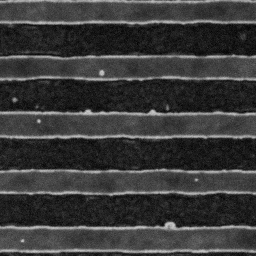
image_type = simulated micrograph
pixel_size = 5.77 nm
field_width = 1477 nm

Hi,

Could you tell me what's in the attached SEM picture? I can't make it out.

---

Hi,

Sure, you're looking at lines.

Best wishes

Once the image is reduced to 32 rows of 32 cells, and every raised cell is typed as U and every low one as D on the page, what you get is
UUUUUUUUUUUUUUUUUUUUUUUUUUUUUUUU
UUUUUUUUUUUUUUUUUUUUUUUUUUUUUUUU
UUUUUUUUUUUUUUUUUUUUUUUUUUUUUUUU
DDDDDDDDDDDDDDDDDDDDDDDDDDDDDDDD
DDDDDDDDDDDDDDDDDDDDDDDDDDDDDDDD
DDDDDDDDDDDDDDDDDDDDDDDDDDDDDDDD
DDDDDDDDDDDDDDDDDDDDDDDDDDDDDDDD
UUUUUUUUUUUUUUUUUUUUUUUUUUUUUUUU
UUUUUUUUUUUUUUUUUUUUUUUUUUUUUUUU
UUUUUUUUUUUUUUUUUUUUUUUUUUUUUUUU
DDDDDDDDDDDDDDDDDDDDDDDDDDDDDDDD
DDDDDDDDDDDDDDDDDDDDDDDDDDDDDDDD
DDDDDDDDDDDDDDDDDDDDDDDDDDDDDDDD
DDDDDDDDDDDDDDDDDDDDDDDDDDDDDDDD
UUUUUUUUUUUUUUUUUUUUUUUUUUUUUUUU
UUUUUUUUUUUUUUUUUUUUUUUUUUUUUUUU
UUUUUUUUUUUUUUUUUUUUUUUUUUUUUUUU
DDDDDDDDDDDDDDDDDDDDDDDDDDDDDDDD
DDDDDDDDDDDDDDDDDDDDDDDDDDDDDDDD
DDDDDDDDDDDDDDDDDDDDDDDDDDDDDDDD
DDDDDDDDDDDDDDDDDDDDDDDDDDDDDDDD
UUUUUUUUUUUUUUUUUUUUUUUUUUUUUUUU
UUUUUUUUUUUUUUUUUUUUUUUUUUUUUUUU
UUUUUUUUUUUUUUUUUUUUUUUUUUUUUUUU
DDDDDDDDDDDDDDDDDDDDDDDDDDDDDDDD
DDDDDDDDDDDDDDDDDDDDDDDDDDDDDDDD
DDDDDDDDDDDDDDDDDDDDDDDDDDDDDDDD
DDDDDDDDDDDDDDDDDDDDDDDDDDDDDDDD
UUUUUUUUUUUUUUUUUUUUUUUUUUUUUUUU
UUUUUUUUUUUUUUUUUUUUUUUUUUUUUUUU
UUUUUUUUUUUUUUUUUUUUUUUUUUUUUUUU
DDDUUUUUDDDDDDDUUUUUUDDDUUDDDDDU